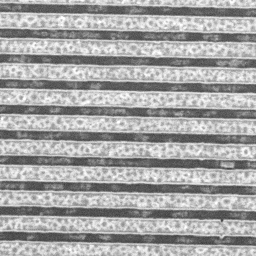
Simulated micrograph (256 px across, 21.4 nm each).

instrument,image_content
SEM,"parallel lines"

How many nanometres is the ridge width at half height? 331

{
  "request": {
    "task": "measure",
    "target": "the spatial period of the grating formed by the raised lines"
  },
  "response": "542 nanometres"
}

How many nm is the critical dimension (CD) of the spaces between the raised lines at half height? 216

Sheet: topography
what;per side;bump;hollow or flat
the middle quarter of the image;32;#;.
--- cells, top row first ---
##########.........##...........
################################
################################
################################
...........................#####
................................
................................
################################
################################
################################
...............#################
................................
................................
###################..#..#.......
################################
################################
################################
................................
................................
#####.##......##................
################################
################################
################################
........................########
................................
................................
################################
################################
################################
........####...#################
................................
................................